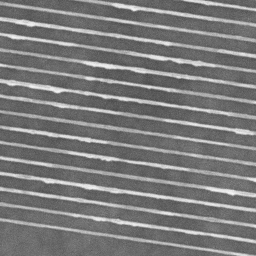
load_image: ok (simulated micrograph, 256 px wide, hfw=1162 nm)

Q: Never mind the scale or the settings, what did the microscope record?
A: parallel lines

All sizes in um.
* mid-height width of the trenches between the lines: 0.06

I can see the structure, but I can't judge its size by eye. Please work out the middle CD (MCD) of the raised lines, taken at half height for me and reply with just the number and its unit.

9.5 nanometres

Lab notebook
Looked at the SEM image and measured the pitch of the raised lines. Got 69.3 nm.